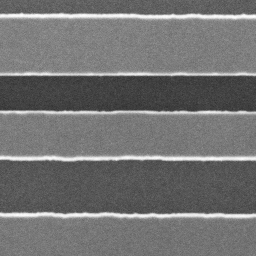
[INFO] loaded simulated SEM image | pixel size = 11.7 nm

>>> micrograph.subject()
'lines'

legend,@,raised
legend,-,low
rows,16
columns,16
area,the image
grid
----------------
@@@@@@@@@@@@@@@@
@@@@@@@@@@@@@@@@
@@@@@@@@@@@@@@@@
@@@@@@@@@@@@@@@@
----------------
----------------
@@@@@@@@@@@@@@@@
@@@@@@@@@@@@@@@@
@@@@@@@@@@@@@@@@
----------------
----------------
----------------
@@@@@@@@@@@@@@@@
@@@@@@@@@@@@@@@@
@@@@@@@@@@@@@@@@